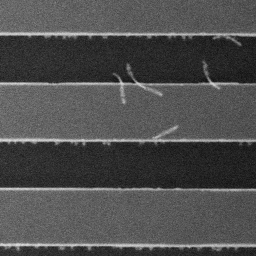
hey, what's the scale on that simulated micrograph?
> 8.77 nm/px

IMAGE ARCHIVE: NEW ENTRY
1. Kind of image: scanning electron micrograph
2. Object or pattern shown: lines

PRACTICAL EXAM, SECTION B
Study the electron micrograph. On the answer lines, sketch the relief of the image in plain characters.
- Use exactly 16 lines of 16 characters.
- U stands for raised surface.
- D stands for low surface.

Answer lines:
UUUUUUUUUUUUUUUU
UUUUUUUUUUUUUUUU
DDDDDDDDDDDDDDDD
DDDDDDDDDDDDDDDD
DDDDDDDDDDDDDDDD
UUUUUUUUUUUUUUUU
UUUUUUUUUUUUUUUU
UUUUUUUUUUUUUUUU
UUUUUUUUUUUUUUUU
DDDDDDDDDDDDDDDD
DDDDDDDDDDDDDDDD
DDDDDDDDDDDDDDDD
UUUUUUUUUUUUUUUU
UUUUUUUUUUUUUUUU
UUUUUUUUUUUUUUUU
DDDDDDDDDDDDDDDD